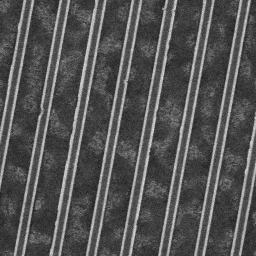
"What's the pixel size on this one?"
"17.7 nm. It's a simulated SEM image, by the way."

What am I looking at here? parallel lines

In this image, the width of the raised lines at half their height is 144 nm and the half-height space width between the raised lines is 27.1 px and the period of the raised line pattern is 628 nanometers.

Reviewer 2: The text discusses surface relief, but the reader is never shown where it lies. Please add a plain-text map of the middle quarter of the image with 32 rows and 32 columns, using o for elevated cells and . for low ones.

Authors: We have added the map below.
.....oo.......oo.......oo.......
.....oo.......oo.......oo.......
.....oo.......oo......ooo.......
.....oo.......oo......oo........
.....oo.......o.......oo........
....oo.......oo.......oo.......o
....oo.......oo.......oo.......o
....oo.......oo......ooo.......o
....oo.......oo......oo........o
....oo.......oo......oo........o
....o.......oo.......oo........o
...oo.......oo.......oo.......oo
...oo.......oo.......oo.......oo
...oo.......oo......ooo.......oo
...oo.......oo......oo........oo
...oo.......oo......oo........oo
..oo.......oo.......oo.......oo.
..oo.......oo.......oo.......oo.
..oo.......oo......ooo.......oo.
..oo.......oo......oo........oo.
..oo.......oo......oo........oo.
..o.......oo.......oo........oo.
.oo.......oo.......oo.......oo..
.oo.......oo.......oo.......oo..
.oo.......oo......ooo.......oo..
.oo.......oo......oo........oo..
.oo.......oo......oo........oo..
oo.......oo.......oo.......oo...
oo.......oo.......oo.......oo...
oo.......oo.......oo.......oo...
oo.......oo......ooo.......oo...
oo.......oo......oo........oo...